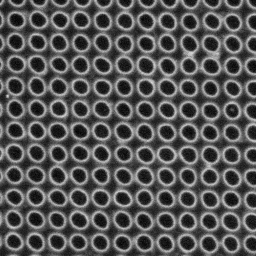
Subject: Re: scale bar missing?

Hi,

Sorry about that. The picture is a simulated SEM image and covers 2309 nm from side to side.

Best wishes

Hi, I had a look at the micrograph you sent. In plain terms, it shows a regular array of holes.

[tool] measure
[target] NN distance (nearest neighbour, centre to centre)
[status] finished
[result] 193 nm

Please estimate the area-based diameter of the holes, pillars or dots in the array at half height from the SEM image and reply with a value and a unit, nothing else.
134 nanometres